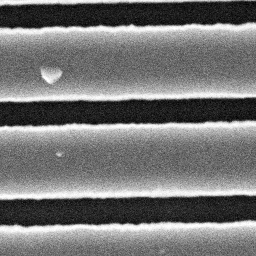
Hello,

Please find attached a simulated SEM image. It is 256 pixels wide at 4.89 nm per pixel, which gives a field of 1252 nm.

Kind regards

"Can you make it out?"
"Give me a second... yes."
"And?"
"lines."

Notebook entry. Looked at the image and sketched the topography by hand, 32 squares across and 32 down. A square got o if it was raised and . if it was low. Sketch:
o...............................
................................
................................
.....ooooooooooooooooooooooooooo
oooooooooooooooooooooooooooooooo
oooooooooooooooooooooooooooooooo
oooooooooooooooooooooooooooooooo
oooooooooooooooooooooooooooooooo
oooooooooooooooooooooooooooooooo
oooooooooooooooooooooooooooooooo
oooooooooooooooooooooooooooooooo
oooooooooooooooooooooooooooooooo
oooooo..........................
................................
................................
................o...oooo.ooooooo
oooooooooooooooooooooooooooooooo
oooooooooooooooooooooooooooooooo
oooooooooooooooooooooooooooooooo
oooooooooooooooooooooooooooooooo
oooooooooooooooooooooooooooooooo
oooooooooooooooooooooooooooooooo
oooooooooooooooooooooooooooooooo
oooooooooooooooooooooooooooooooo
oooooooooooooooooooo............
................................
................................
................................
oooooooooooooooooooooooooooooooo
oooooooooooooooooooooooooooooooo
oooooooooooooooooooooooooooooooo
oooooooooooooooooooooooooooooooo